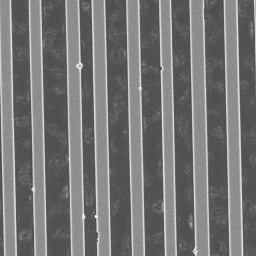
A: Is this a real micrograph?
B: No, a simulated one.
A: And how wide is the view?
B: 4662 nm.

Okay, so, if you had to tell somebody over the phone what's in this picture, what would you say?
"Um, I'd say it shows parallel lines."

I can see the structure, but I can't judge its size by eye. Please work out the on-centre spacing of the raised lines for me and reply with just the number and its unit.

590 nanometres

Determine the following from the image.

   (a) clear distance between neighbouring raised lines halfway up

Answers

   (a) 378 nanometres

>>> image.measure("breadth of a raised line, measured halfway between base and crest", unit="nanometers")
230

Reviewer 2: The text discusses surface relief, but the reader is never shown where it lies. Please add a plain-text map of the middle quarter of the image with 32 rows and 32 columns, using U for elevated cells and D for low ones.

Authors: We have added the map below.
DUUUUDDUUUUDDDDDUUUDDDDDUUUDDDDD
DUUUDDDUUUUDDDDDUUUDDDDDUUUDDDDD
DUUUDDDDUUUDDDDDUUUDDDDDUUUDDDDD
DUUUDDDDUUUDDDDDUUUDDDDDUUUDDDDD
DUUUDDDDUUUDDDDDUUUDDDDDUUUDDDDD
DUUUDDDDUUUDDDDDUUUDDDDDUUUDDDDD
DUUUDDDDUUUDDDDDUUUDDDDDUUUDDDDD
DUUUDDDDUUUDDDDDUUUDDDDDDUUDDDDD
DUUUDDDDUUUDDDDDUUUDDDDDDUUDDDDD
DUUUDDDDUUUDDDDDUUUDDDDDDUUDDDDD
DUUUDDDDUUUDDDDDUUUDDDDDDUUDDDDD
DUUUDDDDUUUDDDDDUUUDDDDDDUUDDDDD
DUUUDDDDUUUDDDDDUUUDDDDDDUUDDDDD
DUUUDDDDUUUDDDDDUUUDDDDDDUUDDDDD
DUUUDDDDUUUDDDDDUUUDDDDDDUUDDDDD
DUUUDDDDUUUDDDDDUUUDDDDDDUUDDDDD
DUUUDDDDUUUDDDDDUUUDDDDDDUUDDDDD
DUUUDDDDUUUDDDDDUUUDDDDDDUUDDDDD
DUUUDDDDUUUDDDDDUUUDDDDDDUUDDDDD
DUUUDDDDUUUDDDDDUUUDDDDDDUUDDDDD
DUUUUDDDUUUDDDDDUUUDDDDDDUUUDDDD
DUUUUDDDUUUDDDDDUUUDDDDDDUUUDDDD
DUUUUDDDUUUDDDDDDUUDDDDDDUUUDDDD
DUUUUDDDUUUDDDDDDUUDDDDDDUUUDDDD
DUUUUDDDUUUDDDDDDUUDDDDDDUUUDDDD
DUUUUDDDUUUDDDDDDUUUDDDDDUUUDDDD
DDUUUDDDUUUDDDDDDUUUDDDDDUUUDDDD
DDUUUDDDUUUDDDDDDUUUDDDDDUUUDDDD
DDUUUDDDUUUDDDDDDUUUDDDDDUUUDDDD
DDUUUDDDUUUDDDDDDUUUDDDDDUUDDDDD
DDUUUDDDUUUDDDDDDUUUDDDDDUUUDDDD
DDUUUDDDUUUDDDDDDUUUDDDDDUUUDDDD